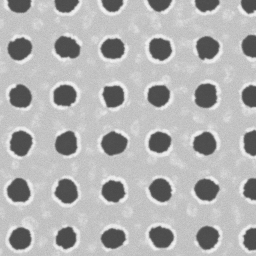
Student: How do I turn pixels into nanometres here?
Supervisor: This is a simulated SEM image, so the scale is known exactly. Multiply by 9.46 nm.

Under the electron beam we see a regular array of holes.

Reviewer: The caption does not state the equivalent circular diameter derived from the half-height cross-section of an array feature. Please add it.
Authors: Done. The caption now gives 219 nm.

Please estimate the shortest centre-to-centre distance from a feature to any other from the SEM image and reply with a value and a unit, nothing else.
45.8 pixels